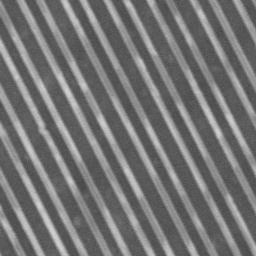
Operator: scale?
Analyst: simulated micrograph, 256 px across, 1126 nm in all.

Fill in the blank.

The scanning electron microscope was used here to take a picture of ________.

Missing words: parallel lines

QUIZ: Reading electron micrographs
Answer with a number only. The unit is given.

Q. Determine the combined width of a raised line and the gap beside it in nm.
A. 84.5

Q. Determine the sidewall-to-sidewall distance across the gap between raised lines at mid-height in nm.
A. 54.3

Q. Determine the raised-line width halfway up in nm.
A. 23.5